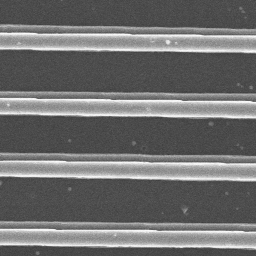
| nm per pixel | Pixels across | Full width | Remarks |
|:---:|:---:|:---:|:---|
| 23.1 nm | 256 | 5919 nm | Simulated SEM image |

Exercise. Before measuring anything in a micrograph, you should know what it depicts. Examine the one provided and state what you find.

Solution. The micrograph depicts lines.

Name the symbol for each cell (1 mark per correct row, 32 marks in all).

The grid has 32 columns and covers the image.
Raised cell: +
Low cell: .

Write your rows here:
................................
................................
................................
++++++++++++++++................
++++++++++++++++++++++++++++++++
++++++++++++++++++++++++++++++++
..............................++
................................
................................
................................
................................
................................
++++++++++++++++++++++++++++++++
++++++++++++++++++++++++++++++++
....................++++++++++++
................................
................................
................................
................................
+++++++++++++++++++.............
++++++++++++++++++++++++++++++++
++++++++++++++++++++++++++++++++
.............................+++
................................
................................
................................
................................
................................
++++++++++++++++++++++++++++++++
++++++++++++++++++++++++++++++++
++++++++++++++++++++++++++++++++
................................